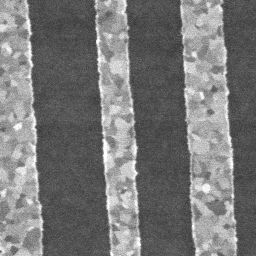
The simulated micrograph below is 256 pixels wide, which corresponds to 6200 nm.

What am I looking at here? one or a few lines or trenches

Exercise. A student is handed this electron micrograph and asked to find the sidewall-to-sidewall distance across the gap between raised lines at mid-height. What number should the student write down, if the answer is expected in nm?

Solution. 1510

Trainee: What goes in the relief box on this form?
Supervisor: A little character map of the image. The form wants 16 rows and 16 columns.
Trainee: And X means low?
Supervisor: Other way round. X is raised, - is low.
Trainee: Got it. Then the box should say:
XX----XX---XXX--
XX----XX---XXX--
XX----XX---XXX--
XX----XX----XX--
XX----XX----XX--
XX----XX----XX--
XX----XX----XX--
XX----XX----XX--
XX-----X----XX--
XX-----X----XX--
XX-----X----XX--
XX-----X----XXX-
XX-----XX---XXX-
XXX----XX---XXX-
XXX----XX---XXX-
XXX----XX---XXX-